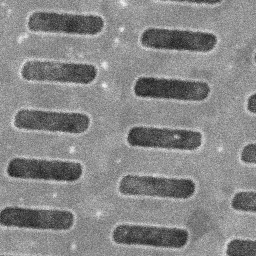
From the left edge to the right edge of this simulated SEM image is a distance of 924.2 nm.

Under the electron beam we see a regular array of holes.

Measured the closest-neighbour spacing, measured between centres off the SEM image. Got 0.177 um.